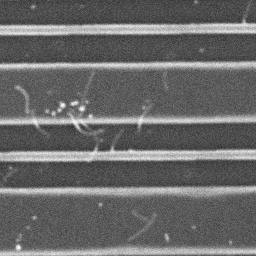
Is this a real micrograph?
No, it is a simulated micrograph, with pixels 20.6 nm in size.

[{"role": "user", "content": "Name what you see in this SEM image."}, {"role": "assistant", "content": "lines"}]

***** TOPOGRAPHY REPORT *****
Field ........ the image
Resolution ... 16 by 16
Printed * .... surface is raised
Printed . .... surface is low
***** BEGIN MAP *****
................
................
................
................
****************
****************
****************
****************
................
.....****.......
................
................
****************
****************
****************
****************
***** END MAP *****